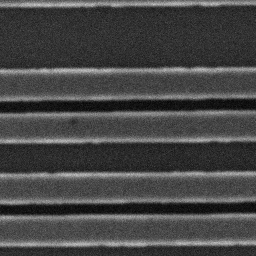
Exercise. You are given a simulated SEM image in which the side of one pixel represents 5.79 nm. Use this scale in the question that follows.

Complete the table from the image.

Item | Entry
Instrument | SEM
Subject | lines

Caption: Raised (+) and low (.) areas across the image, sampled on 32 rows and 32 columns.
++++++++++++++++++++++++++++++++
................................
................................
................................
................................
................................
................................
................................
................................
++++++++++++++++++++++++++++++++
++++++++++++++++++++++++++++++++
++++++++++++++++++++++++++++++++
++++............................
................................
++++++++++++++++++++++++++++++++
++++++++++++++++++++++++++++++++
++++++++++++++++++++++++++++++++
++++++++++++++++++++++++++++++++
................................
................................
................................
................................
++++++++++++++++++++++++++++++++
++++++++++++++++++++++++++++++++
++++++++++++++++++++++++++++++++
................................
................................
++++++++++++++++++++++++++++++++
++++++++++++++++++++++++++++++++
++++++++++++++++++++++++++++++++
+++++++++++++++++++++++++++++...
................................